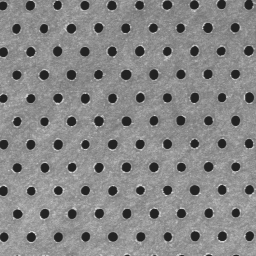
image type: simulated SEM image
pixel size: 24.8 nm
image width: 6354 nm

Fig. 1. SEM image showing a regular array of holes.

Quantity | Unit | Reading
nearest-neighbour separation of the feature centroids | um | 0.657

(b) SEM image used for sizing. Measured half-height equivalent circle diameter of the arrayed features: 235 nanometres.